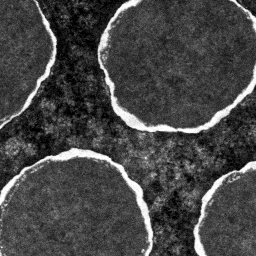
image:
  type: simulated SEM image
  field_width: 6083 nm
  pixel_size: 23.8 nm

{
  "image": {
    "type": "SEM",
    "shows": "raised bodies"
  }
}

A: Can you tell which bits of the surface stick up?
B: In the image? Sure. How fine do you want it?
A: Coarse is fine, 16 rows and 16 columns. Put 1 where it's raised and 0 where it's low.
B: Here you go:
1100000011111110
1110000111111111
1110001111111111
1110001111111111
1110000111111111
1100000111111111
1100000111111110
1000000011111000
0000000000000000
0000000000000000
0011111000000001
0111111100000111
1111111110000111
1111111110000111
1111111110001111
1111111110001111